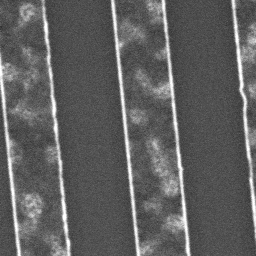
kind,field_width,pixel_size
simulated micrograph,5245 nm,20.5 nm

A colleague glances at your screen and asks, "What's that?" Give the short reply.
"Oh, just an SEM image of one or a few lines or trenches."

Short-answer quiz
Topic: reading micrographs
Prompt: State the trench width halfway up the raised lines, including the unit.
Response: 1410 nanometers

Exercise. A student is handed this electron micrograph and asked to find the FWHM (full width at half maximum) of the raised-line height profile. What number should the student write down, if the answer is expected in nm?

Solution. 1040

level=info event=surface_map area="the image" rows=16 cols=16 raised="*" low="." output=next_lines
***....***.....*
***....***.....*
***....***.....*
***....****....*
***....****....*
***.....***....*
***.....***....*
***.....***....*
****....***....*
.***....***.....
.***....***.....
.***....***.....
.***....***.....
.***....****....
.***....****....
.***.....***....